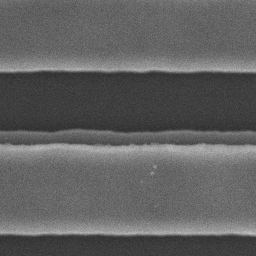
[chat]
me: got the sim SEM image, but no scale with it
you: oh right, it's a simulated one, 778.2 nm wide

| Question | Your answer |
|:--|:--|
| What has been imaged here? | lines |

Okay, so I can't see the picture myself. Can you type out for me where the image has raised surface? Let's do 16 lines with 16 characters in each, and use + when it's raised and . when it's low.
++++++++++++++++
++++++++++++++++
++++++++++++++++
++++++++++++++++
................
................
................
................
................
++++++++++++++++
++++++++++++++++
++++++++++++++++
++++++++++++++++
++++++++++++++++
++++++++++++++++
................